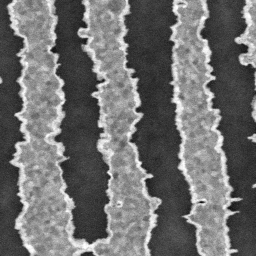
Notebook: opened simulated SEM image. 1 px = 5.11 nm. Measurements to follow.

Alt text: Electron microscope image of one or a few lines or trenches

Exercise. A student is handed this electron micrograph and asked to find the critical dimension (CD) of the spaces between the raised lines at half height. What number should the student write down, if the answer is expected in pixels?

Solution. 41.4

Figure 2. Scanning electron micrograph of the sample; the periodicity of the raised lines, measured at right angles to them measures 406 nm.